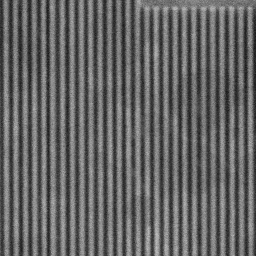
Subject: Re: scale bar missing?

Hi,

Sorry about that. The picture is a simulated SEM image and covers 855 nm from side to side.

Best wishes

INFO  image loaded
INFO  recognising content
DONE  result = parallel lines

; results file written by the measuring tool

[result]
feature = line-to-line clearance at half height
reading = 0.0154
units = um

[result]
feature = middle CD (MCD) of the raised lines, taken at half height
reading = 15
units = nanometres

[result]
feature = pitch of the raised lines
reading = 31.3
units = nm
